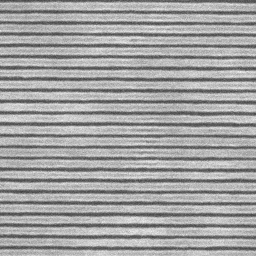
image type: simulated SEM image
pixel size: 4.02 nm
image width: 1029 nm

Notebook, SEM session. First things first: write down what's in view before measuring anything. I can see parallel lines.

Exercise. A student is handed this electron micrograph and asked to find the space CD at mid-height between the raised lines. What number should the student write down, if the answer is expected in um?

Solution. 0.0171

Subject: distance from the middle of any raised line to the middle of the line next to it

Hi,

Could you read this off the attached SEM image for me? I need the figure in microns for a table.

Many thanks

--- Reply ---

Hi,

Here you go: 0.0452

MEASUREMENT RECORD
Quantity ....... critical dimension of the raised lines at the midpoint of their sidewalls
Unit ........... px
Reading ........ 6.77